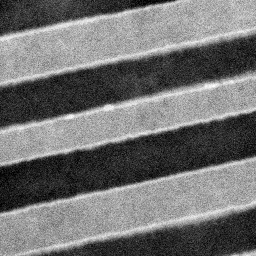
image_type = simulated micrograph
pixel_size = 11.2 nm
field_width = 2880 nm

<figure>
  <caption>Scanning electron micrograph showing lines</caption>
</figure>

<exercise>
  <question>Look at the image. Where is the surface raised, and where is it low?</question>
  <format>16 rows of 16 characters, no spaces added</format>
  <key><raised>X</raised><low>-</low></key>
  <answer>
---------XXXXXXX
----XXXXXXXXXXXX
XXXXXXXXXXXXX---
XXXXXXXX--------
XXX-------------
------------XXXX
--------XXXXXXXX
---XXXXXXXXXX---
XXXXXXXX--------
XXXX------------
-------------XXX
---------XXXXXXX
----XXXXXXXXXXXX
XXXXXXXXXXXXX---
XXXXXXXX--------
XXX-------------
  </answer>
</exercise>